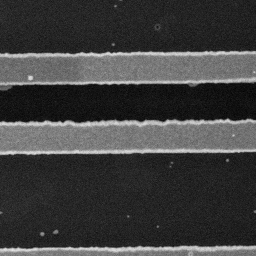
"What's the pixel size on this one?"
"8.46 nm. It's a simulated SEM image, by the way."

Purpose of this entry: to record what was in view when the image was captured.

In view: lines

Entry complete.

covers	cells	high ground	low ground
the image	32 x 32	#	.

................................
................................
................................
................................
................................
................................
.........................#.#####
################################
################################
################################
###########.####.#..............
................................
................................
................................
................................
################################
################################
################################
################################
................................
................................
................................
................................
................................
................................
................................
................................
................................
................................
................................
................................
################################